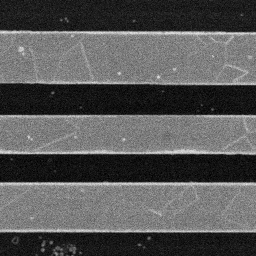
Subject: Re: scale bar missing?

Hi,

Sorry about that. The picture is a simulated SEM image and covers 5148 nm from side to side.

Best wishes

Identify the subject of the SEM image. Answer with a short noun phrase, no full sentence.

lines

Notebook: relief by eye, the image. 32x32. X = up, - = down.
--------------------------------
--------------------------------
--------------------------------
--------------------------------
XXXXXXXXXXXXXXXXXXXXXXXXXXXXXXXX
XXXXXXXXXXXXXXXXXXXXXXXXXXXXXXXX
XXXXXXXXXXXXXXXXXXXXXXXXXXXXXXXX
XXXXXXXXXXXXXXXXXXXXXXXXXXXXXXXX
XXXXXXXXXXXXXXXXXXXXXXXXXXXXXXXX
XXXXXXXXXXXXXXXXXXXXXXXXXXXXXXXX
--------------------XXXXXXXXXXXX
--------------------------------
--------------------------------
--------------------------------
XXXXXXXXXXXXXXXXXXXXXXXXXXXXXXXX
XXXXXXXXXXXXXXXXXXXXXXXXXXXXXXXX
XXXXXXXXXXXXXXXXXXXXXXXXXXXXXXXX
XXXXXXXXXXXXXXXXXXXXXXXXXXXXXXXX
XXXXXXXXXXXXXXXXXXXXXXXXXXXXXXXX
--------------------------------
--------------------------------
--------------------------------
--------------------------------
XXXXXXXXXXXXXXXXXXXXXXXXXXXXXXXX
XXXXXXXXXXXXXXXXXXXXXXXXXXXXXXXX
XXXXXXXXXXXXXXXXXXXXXXXXXXXXXXXX
XXXXXXXXXXXXXXXXXXXXXXXXXXXXXXXX
XXXXXXXXXXXXXXXXXXXXXXXXXXXXXXXX
XXXXXXXXXXXXXXXXXXXXXXXXXXXXXXXX
--------------------------------
--------------------------------
--------------------------------